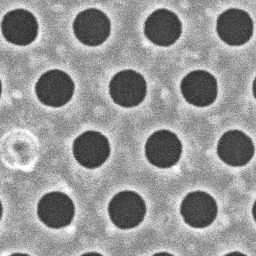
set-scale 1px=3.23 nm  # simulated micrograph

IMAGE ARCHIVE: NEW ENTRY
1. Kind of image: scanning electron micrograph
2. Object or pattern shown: a regular array of holes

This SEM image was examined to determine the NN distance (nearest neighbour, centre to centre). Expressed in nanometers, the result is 226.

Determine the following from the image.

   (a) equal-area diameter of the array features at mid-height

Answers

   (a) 125 nm